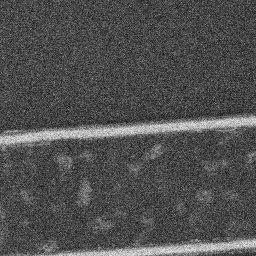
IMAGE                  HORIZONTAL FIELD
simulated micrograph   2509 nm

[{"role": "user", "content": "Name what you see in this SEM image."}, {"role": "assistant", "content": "one or a few lines or trenches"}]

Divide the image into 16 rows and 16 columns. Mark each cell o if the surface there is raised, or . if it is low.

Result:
................
................
................
................
................
................
................
................
..oooooooooooooo
oooooooooooooooo
oooooooooooooooo
oooooooooooooooo
oooooooooooooooo
oooooooooooooooo
oooooooooooooooo
ooooooooooooo...